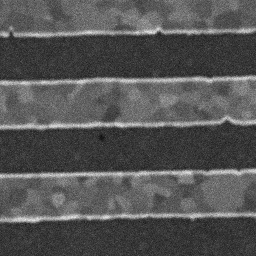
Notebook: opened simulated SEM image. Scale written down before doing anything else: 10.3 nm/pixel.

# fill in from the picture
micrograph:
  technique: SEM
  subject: one or a few lines or trenches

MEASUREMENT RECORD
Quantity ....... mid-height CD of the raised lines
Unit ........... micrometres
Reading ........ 0.454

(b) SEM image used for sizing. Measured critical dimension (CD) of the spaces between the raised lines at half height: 497 nanometers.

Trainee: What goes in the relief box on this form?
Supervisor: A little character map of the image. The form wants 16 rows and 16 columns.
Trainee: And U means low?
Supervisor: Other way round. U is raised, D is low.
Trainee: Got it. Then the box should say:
UUUUUUUUUUUUUUUU
UUUUUUUUUUUUUUUU
DDDDDDDDDDDDDDDD
DDDDDDDDDDDDDDDD
DDDDDDDDDDDDDDDD
UUUUUUUUUUUUUUUU
UUUUUUUUUUUUUUUU
UUUUUUUUUUUUUUUU
DDDDDDDDDDDDDDDD
DDDDDDDDDDDDDDDD
DDDDDDDDDDDDDDDD
UUUUUUUUUUUUUUUU
UUUUUUUUUUUUUUUU
UUUUUUUUUDDUDDDD
DDDDDDDDDDDDDDDD
DDDDDDDDDDDDDDDD